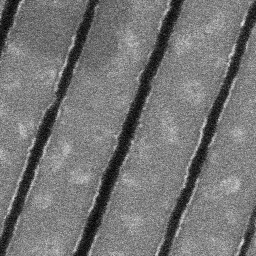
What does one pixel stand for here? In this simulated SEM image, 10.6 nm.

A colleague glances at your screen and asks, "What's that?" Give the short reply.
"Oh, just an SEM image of one or a few lines or trenches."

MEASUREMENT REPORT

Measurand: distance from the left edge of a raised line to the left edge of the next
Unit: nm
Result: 815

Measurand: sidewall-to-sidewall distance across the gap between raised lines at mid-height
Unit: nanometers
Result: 658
